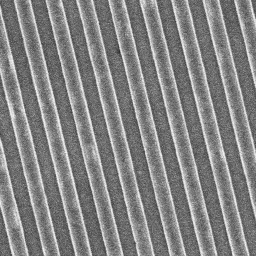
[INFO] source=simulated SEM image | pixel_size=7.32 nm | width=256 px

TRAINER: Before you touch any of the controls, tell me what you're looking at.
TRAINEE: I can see parallel lines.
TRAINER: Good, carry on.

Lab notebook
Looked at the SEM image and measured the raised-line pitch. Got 224 nm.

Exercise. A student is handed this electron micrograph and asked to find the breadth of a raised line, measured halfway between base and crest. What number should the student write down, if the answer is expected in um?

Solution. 0.111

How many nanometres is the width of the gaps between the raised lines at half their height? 112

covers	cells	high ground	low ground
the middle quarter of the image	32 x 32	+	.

+++....++++....++++....++++....+
+++.....+++.....+++....++++....+
++++....++++....+++.....+++....+
++++....++++....++++....+++.....
++++....++++....++++....++++....
.+++....++++....++++....++++....
.++++....++++....+++.....+++....
.++++....++++....++++....+++....
.++++....++++....++++....++++...
..+++....++++....++++....++++...
..++++....+++.....+++.....+++...
..++++....++++....++++....+++...
...+++....++++....++++....++++..
...+++....++++....++++....++++..
...++++....+++.....+++....++++..
...++++....++++....++++....+++..
...++++....++++....++++....++++.
...++++....++++....++++....++++.
....++++....+++....++++....++++.
....++++....++++....+++.....+++.
....++++....++++....++++....++++
.....+++.....+++....++++....++++
+....++++....+++.....+++....++++
+....++++....++++....+++.....+++
+....++++....++++....++++....+++
+....++++....++++....++++....+++
++....+++....++++.....+++....+++
++....++++....++++....+++.....++
++....++++....++++....++++....++
++.....+++....++++....++++....++
+++....+++....++++....++++....++
+++....++++....++++....+++.....+